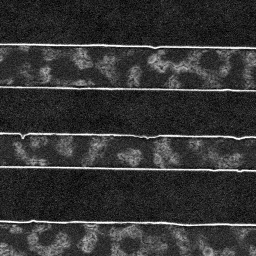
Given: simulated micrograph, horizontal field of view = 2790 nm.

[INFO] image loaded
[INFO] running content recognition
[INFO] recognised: one or a few lines or trenches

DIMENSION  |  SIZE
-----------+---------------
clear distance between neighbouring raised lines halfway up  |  407 nm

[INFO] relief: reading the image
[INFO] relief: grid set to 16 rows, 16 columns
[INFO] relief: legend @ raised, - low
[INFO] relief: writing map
@@@@@@@@@@@@@@@@
@@@@@@@@@@@@@@@@
@@@@@@@@@@@@@@@@
----------------
----------------
@@@@@@----------
@@@@@@@@@@@@@@@@
@@@@@@@@@@@@@@@@
--------@@-@@@@@
----------------
@@@@@-----------
@@@@@@@@@@@@@@@@
@@@@@@@@@@@@@@@@
@@@@@@@@@@@@@@@@
----------------
----------------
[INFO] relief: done